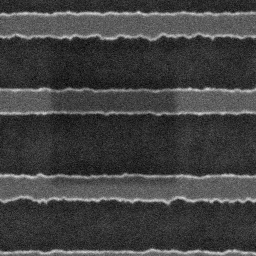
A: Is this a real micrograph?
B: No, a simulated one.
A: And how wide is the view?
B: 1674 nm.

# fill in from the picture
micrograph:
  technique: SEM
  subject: lines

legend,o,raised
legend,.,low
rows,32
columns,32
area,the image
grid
................................
................................
oooooooooooooooooooooooooooooooo
oooooooooooooooooooooooooooooooo
oooooooooooooooooooo.ooo.ooooooo
................................
................................
................................
................................
................................
................................
oooooooooooooooooooooooooooooooo
oooooooooooooooooooooooooooooooo
oooooooooooooooooooooooooooooooo
................................
................................
................................
................................
................................
................................
................................
................................
oooooooooooooooooooooooooooooooo
oooooooooooooooooooooooooooooooo
oooooooooooooooooooooooooooooooo
................................
................................
................................
................................
................................
................................
..ooo.ooooooooooo.ooooooooo.ooo.